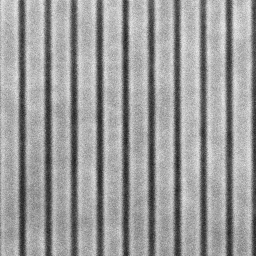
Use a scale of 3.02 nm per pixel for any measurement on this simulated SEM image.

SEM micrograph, parallel lines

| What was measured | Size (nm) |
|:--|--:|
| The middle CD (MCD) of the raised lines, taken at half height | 57.3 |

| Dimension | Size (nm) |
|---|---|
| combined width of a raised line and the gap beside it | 78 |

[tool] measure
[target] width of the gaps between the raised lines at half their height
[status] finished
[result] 21.9 nanometres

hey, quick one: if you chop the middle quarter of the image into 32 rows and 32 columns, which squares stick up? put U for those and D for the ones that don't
UDDUUUUUDDUUUUDDUUUUUDDUUUUDDUUU
UDDUUUUUDDUUUUDDUUUUUDDUUUUDDUUU
UDDUUUUUDDUUUUDDUUUUUDDUUUUDDUUU
UDDUUUUUDDUUUUDDUUUUUDDUUUUDDUUU
UDDUUUUUDDUUUUDDUUUUUDDUUUUDDUUU
UDDUUUUUDDUUUUDDUUUUUDDUUUUDDUUU
UDDUUUUUDDUUUUDDUUUUUDDUUUUDDUUU
UDDUUUUUDDUUUUDDUUUUUDDUUUUDDUUU
UDDDUUUUDDUUUUDDUUUUUDDUUUUDDUUU
UDDDUUUUDDUUUUDDUUUUUDDUUUUDDUUU
UDDDUUUUDDUUUUDDUUUUUDDUUUUDDUUU
UDDDUUUUDDUUUUDDUUUUUDDUUUUDDUUU
UDDDUUUUDDUUUUDDUUUUUDDUUUUDDUUU
UDDDUUUUDDUUUUDDUUUUUDDUUUUDDUUU
UDDDUUUUDDUUUUDDUUUUUDDUUUUDDUUU
UDDDUUUUDDUUUUDDUUUUUDDUUUUDDUUU
UDDDUUUUDDUUUUDDUUUUUDDUUUUDDUUU
UDDDUUUUDDUUUUDDUUUUUDDUUUUDDUUU
UDDDUUUUDDUUUUDDUUUUUDDUUUUDDUUU
UDDDUUUUDDUUUUDDUUUUUDDUUUUDDUUU
UDDDUUUUDDUUUUDDUUUUUDDUUUUDDUUU
UDDDUUUUDDUUUUDDUUUUUDDUUUUDDUUU
UDDDUUUUDDUUUUDDUUUUUDDUUUUDDUUU
UDDDUUUUDDUUUUDDUUUUUDDUUUUDDUUU
UDDDUUUUDDUUUUDDUUUUUDDUUUUDDUUU
UDDDUUUUDDUUUUDDUUUUUDDUUUUDDUUU
UDDDUUUUDDUUUUDDUUUUUDDUUUUDDUUU
UDDDUUUUDDUUUUDDUUUUUDDUUUUDDUUU
UDDDUUUUDDUUUUDDUUUUUDDUUUUDDUUU
UDDDUUUUDDUUUUDDUUUUUDDUUUUDDUUU
UDDDUUUUDDUUUUDDUUUUUDDUUUUDDUUU
UDDDUUUUDDUUUUDDUUUUUDDUUUUDDUUU